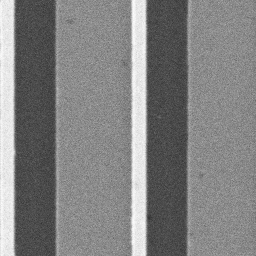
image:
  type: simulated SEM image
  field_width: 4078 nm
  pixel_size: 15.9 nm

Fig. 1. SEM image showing lines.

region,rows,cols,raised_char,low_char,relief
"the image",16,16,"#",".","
#...#####...####
#...#####...####
#...#####...####
#...#####...####
#...#####...####
#...#####...####
#...#####...####
#...#####...####
#...#####...####
#...#####...####
#...#####...####
#...#####...####
#...#####...####
#...#####...####
#...#####...####
#...#####...####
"